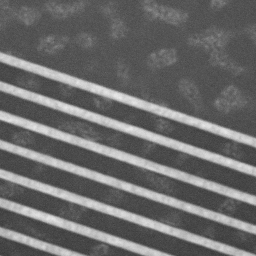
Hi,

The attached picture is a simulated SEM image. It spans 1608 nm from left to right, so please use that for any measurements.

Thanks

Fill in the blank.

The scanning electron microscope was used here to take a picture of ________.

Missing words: parallel lines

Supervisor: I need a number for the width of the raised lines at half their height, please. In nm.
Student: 47.6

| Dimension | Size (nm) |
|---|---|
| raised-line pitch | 173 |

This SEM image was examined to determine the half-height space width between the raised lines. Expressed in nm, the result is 127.